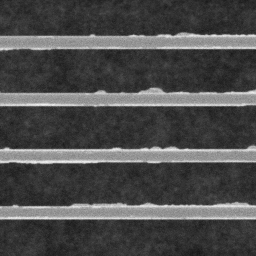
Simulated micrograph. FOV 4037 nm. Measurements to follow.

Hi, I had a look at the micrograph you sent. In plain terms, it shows lines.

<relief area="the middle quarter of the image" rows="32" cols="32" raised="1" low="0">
00000000000000000000000000000000
00000000000000000000000000000000
00000000000000000000000000000000
00000000000000000000000000000000
00000000000000000000000000000000
00000000000000000000000000000000
00000000000000000000000000000000
11111111111111111111111111111111
11111111111111111111111111111111
11111111111111111111111111111111
00000000000000000000000000000000
00000000000000000000000000000000
00000000000000000000000000000000
00000000000000000000000000000000
00000000000000000000000000000000
00000000000000000000000000000000
00000000000000000000000000000000
00000000000000000000000000000000
00000000000000000000000000000000
00000000000000000000000000000000
00000000000000000000000000000000
00000000000000000000000000000000
11111111111111111111111111111111
11111111111111111111111111111111
11100110000000000000011100000000
00000000000000000000000000000000
00000000000000000000000000000000
00000000000000000000000000000000
00000000000000000000000000000000
00000000000000000000000000000000
00000000000000000000000000000000
00000000000000000000000000000000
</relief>